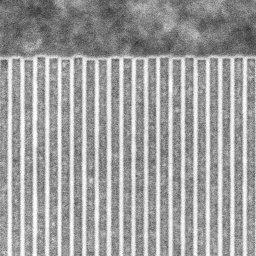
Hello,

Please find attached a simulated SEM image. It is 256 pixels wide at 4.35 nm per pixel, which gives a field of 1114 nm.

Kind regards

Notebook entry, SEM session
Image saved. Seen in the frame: parallel lines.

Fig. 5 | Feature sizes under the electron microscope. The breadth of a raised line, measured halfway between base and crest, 14.1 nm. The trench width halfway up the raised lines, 9.26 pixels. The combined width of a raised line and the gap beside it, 12.4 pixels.